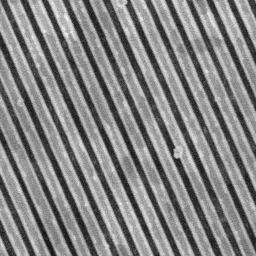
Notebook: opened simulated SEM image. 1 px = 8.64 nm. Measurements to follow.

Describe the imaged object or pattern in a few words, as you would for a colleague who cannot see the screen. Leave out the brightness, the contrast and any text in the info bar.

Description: parallel lines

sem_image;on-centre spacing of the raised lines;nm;163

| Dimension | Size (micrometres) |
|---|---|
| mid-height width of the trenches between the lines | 0.0732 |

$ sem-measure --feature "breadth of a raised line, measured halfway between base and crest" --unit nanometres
87.1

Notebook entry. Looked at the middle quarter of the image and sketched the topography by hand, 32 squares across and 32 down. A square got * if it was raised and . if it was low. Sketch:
*...**...**...**...***..***..***
*...***..***..***...**...**...**
**...**...**...**...***..***..**
**...***..***..***...**...**...*
***..***...**...**...**...***..*
.**...***..***..***..***..***...
.***..***...**...**...**...***..
.***...**...**...***..***..***..
..***..***..***..***...**...**..
...**...**...**...***..**...***.
...**...***..***..***...**...**.
*..***...**...**...**...**...***
*...**...***..***..***...**...**
**..***..***...**...**...**...**
**...**...**...***..***..***..**
***..***..***...**...**...**...*
***...**...**...**...***..***..*
.**...***..***..***..***...**...
.***..***...**...**...***..***..
..**...**...***..***..***...**..
..***..***..***...**...**...**..
...**...**...***..***..***..***.
...***..***..***..***...**..***.
*..***...**...**...**...***..***
*...***..***..***..***...**...**
**..***...**...**...**...**...**
**...**...***..***..***..***...*
***..***..***...**...**...**...*
***...**...**...***..***..***...
.***..***..***..***...**...**...
.***...**...**...***..***..***..
..**...***..***..***..***...**..